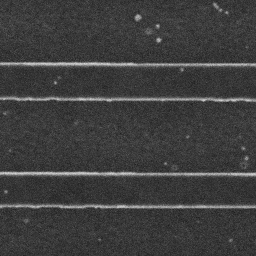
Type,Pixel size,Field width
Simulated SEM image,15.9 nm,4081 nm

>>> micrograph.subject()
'lines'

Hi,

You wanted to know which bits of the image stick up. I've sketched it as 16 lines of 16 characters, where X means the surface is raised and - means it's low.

----------------
----------------
----------------
----------------
XXXXXXXXXXXXXXXX
XXXXXXXXXXXXXXXX
----------------
----------------
----------------
----------------
----------------
XXXXXXXXXXXXXXXX
XXXXXXXXXXXXXXXX
----------------
----------------
----------------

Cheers